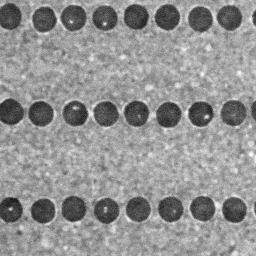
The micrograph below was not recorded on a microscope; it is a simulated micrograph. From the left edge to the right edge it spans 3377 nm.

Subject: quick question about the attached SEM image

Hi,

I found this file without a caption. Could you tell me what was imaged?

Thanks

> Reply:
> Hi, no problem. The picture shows a regular array of holes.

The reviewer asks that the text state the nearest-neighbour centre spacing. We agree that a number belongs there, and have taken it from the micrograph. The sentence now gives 410 nanometres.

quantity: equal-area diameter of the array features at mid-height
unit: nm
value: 352